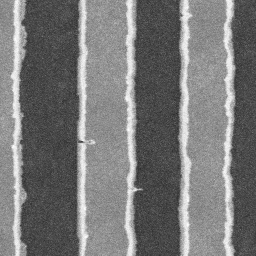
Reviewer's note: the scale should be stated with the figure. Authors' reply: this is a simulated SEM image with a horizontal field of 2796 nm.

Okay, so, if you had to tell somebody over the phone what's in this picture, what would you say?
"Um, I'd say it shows one or a few lines or trenches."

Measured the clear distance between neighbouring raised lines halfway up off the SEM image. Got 672 nanometers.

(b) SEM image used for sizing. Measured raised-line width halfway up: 0.491 µm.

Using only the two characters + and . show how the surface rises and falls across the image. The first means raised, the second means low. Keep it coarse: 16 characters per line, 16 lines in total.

+....+++....++..
+....+++....++..
+....+++....++..
+....+++....++..
+....+++....++..
+....+++....++..
+....+++....++..
+....+++....++..
+....+++....++..
+....+++....++..
+....+++....++..
+....+++....++..
+....+++....++..
+....+++....++..
+....+++....++..
+....+++....++..